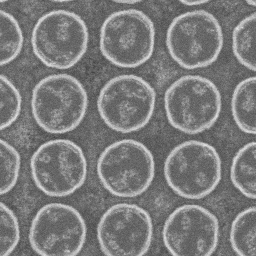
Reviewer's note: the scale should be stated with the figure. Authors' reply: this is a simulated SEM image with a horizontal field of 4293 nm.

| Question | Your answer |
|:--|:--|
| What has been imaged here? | a regular array of raised bodies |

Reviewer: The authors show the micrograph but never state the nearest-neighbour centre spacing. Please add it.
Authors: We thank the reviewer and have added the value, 1.08 um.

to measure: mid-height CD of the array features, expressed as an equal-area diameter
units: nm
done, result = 888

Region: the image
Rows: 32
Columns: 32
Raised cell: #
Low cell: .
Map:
................................
................................
##...#####....####....#####....#
##..######...######..######...##
###.#######..######..#######.###
##..#######..######..#######.###
##...#####...######...#####..###
#....####.....####....####....##
................................
................................
#....#####....####....####....##
##..######...######..######...##
##..#######..######..######..###
##..######...######..######..###
##...#####...######..######..###
#....####.....####....####....##
................................
................................
#....#####....####....####.....#
##..######...######..######...##
##..#######.#######..######..###
##..######..#######..######..###
##...#####...######..######..###
#....####.....####....####....##
........................#.......
................................
#....####.....####....####.....#
##...#####...######..######...##
##..######...######..######..###
##..######..#######..######..###
##..######...#####...######..###
#....####....#####....####....##